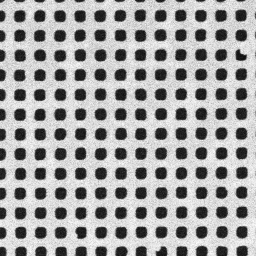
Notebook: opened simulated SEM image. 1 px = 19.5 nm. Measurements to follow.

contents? a regular array of holes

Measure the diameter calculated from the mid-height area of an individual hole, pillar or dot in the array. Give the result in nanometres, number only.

243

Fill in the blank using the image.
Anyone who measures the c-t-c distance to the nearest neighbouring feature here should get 0.381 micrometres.